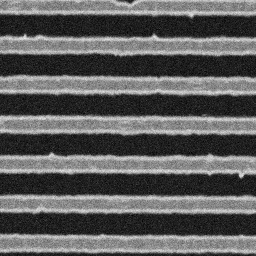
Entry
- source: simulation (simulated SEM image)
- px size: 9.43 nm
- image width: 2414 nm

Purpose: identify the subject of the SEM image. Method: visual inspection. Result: parallel lines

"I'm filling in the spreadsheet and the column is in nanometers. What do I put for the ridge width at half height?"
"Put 143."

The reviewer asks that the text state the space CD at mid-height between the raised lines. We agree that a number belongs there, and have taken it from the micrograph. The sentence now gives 24.1 px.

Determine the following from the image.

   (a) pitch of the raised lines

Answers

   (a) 39.6 pixels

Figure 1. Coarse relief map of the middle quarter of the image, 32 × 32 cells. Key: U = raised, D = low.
DDDDDDDDDDDDDDDDDDDDDDDDDDDDDDDD
DDDDDDDDDDDDDDDDDDDDDDDDDDDDDDDD
DDDDDDDDDDDDDDDDDDDDDDDDDDDDDDDD
UUUUUUUUUUDDDDDDDDDDDDDDDDDDDDDD
UUUUUUUUUUUUUUUUUUUUUUUUUUUUUUUU
UUUUUUUUUUUUUUUUUUUUUUUUUUUUUUUU
UUUUUUUUUUUUUUUUUUUUUUUUUUUUUUUU
DDDDDDDDDDDDDDDDDDDDDDDDDDDDDDDD
DDDDDDDDDDDDDDDDDDDDDDDDDDDDDDDD
DDDDDDDDDDDDDDDDDDDDDDDDDDDDDDDD
DDDDDDDDDDDDDDDDDDDDDDDDDDDDDDDD
DDDDDDDDDDDDDDDDDDDDDDDDDDDDDDDD
DDDDDDDDDDDDDDDDDDDDDDDDDDDDDDDD
UUUUUUUUUDDDDDDUDDDDDUUUUUDUDDDD
UUUUUUUUUUUUUUUUUUUUUUUUUUUUUUUU
UUUUUUUUUUUUUUUUUUUUUUUUUUUUUUUU
UUUUUUUUUUUUUUUUUUUUUUUUUUUUUUUU
DDDDDDDDDDDDDDDDDDDDDDDDDDDDDDDD
DDDDDDDDDDDDDDDDDDDDDDDDDDDDDDDD
DDDDDDDDDDDDDDDDDDDDDDDDDDDDDDDD
DDDDDDDDDDDDDDDDDDDDDDDDDDDDDDDD
DDDDDDDDDDDDDDDDDDDDDDDDDDDDDDDD
DDDDDDDDDDDDDDDDDDDDDDDDDDDDDDDD
DUUUUUUDUUUUUUDUUUUUUDDDDUUUUUUU
UUUUUUUUUUUUUUUUUUUUUUUUUUUUUUUU
UUUUUUUUUUUUUUUUUUUUUUUUUUUUUUUU
UUUUUUUUUUUUUUUUUUUUUUUUUUUUUUUU
DDDDDDDDDDDDDDDDDDDDDDDDDDDDDDDD
DDDDDDDDDDDDDDDDDDDDDDDDDDDDDDDD
DDDDDDDDDDDDDDDDDDDDDDDDDDDDDDDD
DDDDDDDDDDDDDDDDDDDDDDDDDDDDDDDD
DDDDDDDDDDDDDDDDDDDDDDDDDDDDDDDD